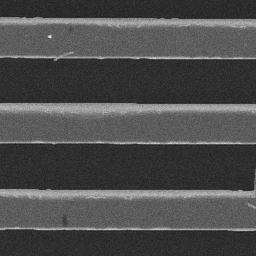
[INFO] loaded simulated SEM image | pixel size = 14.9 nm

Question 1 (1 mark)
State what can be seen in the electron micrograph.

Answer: lines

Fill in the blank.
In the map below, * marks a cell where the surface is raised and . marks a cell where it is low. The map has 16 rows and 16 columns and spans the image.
................
****************
****************
****************
................
................
................
****************
****************
................
................
................
****************
****************
................
................